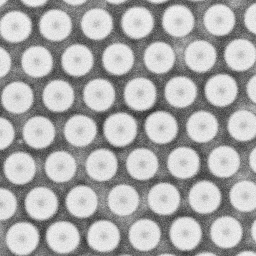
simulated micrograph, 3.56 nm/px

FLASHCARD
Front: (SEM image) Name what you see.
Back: an array of small figures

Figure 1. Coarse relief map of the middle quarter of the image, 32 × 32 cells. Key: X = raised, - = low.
XXXXXXX---XXXXXXX----XXXXXX----X
XXXXXX-----XXXXX-----XXXXX------
--XXX---------------------------
----------------------------XX--
-------XXXX-----XXXXXX----XXXXXX
X-----XXXXXX----XXXXXX----XXXXXX
XX---XXXXXXX---XXXXXXXX--XXXXXXX
XX---XXXXXXXX--XXXXXXXX--XXXXXXX
XX---XXXXXXX---XXXXXXXX---XXXXXX
XX---XXXXXXX----XXXXXX----XXXXXX
XX----XXXXX------XXXX-------XXX-
--------XX----------------------
-----------------------XXX------
--XXXX------XXXXX----XXXXXX----X
-XXXXXX----XXXXXX----XXXXXXX---X
XXXXXXXX--XXXXXXXX---XXXXXXX---X
XXXXXXXX--XXXXXXXX---XXXXXXX---X
XXXXXXXX--XXXXXXXX---XXXXXXX---X
-XXXXXX----XXXXXX----XXXXXX-----
-XXXXXX-----XXXXX------XXX------
---XX---------------------------
------------------XXX-------XXXX
X------XXXXX-----XXXXXX----XXXXX
XX----XXXXXXX---XXXXXXX---XXXXXX
XXX---XXXXXXX---XXXXXXX---XXXXXX
XXX---XXXXXXX---XXXXXXX---XXXXXX
XXX---XXXXXXX---XXXXXXX---XXXXXX
XXX---XXXXXXX----XXXXXX----XXXXX
XX-----XXXXX------XXX--------X--
--------------------------------
-------------XXX-------XXXX-----
--XXXXX-----XXXXXX----XXXXXX----